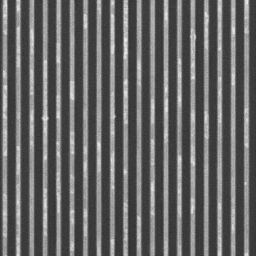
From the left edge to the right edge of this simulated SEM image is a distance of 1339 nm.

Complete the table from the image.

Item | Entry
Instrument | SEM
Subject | parallel lines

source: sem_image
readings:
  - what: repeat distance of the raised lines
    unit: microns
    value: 0.0702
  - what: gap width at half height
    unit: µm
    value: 0.0458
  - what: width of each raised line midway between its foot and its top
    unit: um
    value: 0.0255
